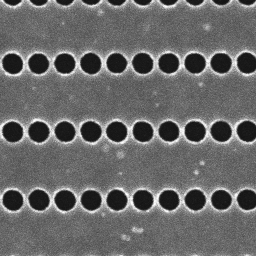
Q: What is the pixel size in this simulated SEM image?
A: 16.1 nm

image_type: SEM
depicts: a regular array of holes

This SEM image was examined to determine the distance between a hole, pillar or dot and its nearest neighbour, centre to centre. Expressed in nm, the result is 416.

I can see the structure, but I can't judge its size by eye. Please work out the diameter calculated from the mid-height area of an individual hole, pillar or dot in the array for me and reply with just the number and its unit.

345 nanometres